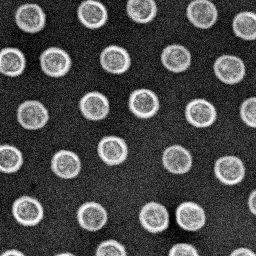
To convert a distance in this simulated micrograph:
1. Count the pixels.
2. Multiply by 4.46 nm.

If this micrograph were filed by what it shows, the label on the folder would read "a regular array of raised bodies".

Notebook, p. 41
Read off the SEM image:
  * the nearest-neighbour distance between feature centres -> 229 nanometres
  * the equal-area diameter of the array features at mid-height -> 27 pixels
